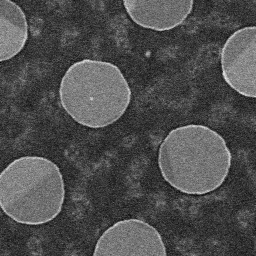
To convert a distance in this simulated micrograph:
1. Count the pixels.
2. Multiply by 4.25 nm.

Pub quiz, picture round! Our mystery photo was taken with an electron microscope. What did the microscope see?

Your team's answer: raised bodies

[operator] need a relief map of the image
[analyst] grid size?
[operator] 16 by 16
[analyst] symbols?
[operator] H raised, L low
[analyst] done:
HLLLLLLLHHHHLLLL
HHLLLLLLLHHLLLLL
HHLLLLLLLLLLLLHH
HLLLLLLLLLLLLLHH
LLLLHHHLLLLLLLHH
LLLLHHHHLLLLLLLH
LLLLHHHHLLLLLLLL
LLLLLHHLLLLLLLLL
LLLLLLLLLLLHHHLL
LLLLLLLLLLHHHHLL
HHHHLLLLLLHHHHLL
HHHHLLLLLLLHHHLL
HHHHLLLLLLLLLLLL
LHHLLLLLLLLLLLLL
LLLLLLLHHHLLLLLL
LLLLLLHHHHLLLLLL